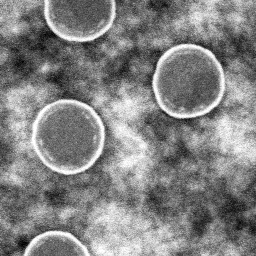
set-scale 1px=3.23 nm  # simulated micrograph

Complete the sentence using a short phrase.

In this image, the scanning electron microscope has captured raised bodies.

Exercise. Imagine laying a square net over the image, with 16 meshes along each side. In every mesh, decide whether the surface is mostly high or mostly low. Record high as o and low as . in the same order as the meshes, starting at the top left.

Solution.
...oooo.........
...oooo.........
................
..........ooo...
..........oooo..
..........oooo..
...oo.....ooo...
..oooo..........
..oooo..........
..oooo..........
...oo...........
................
................
................
................
..ooo...........